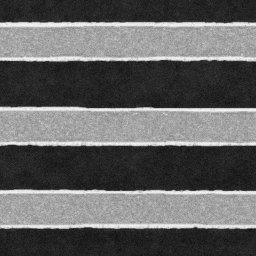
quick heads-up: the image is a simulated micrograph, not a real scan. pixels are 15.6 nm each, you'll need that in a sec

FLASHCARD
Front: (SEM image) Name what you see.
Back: lines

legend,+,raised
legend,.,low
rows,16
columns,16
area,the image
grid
................
................
++++++++++++++++
++++++++++++++++
................
................
................
++++++++++++++++
++++++++++++++++
................
................
................
++++++++++++++++
++++++++++++++++
................
................